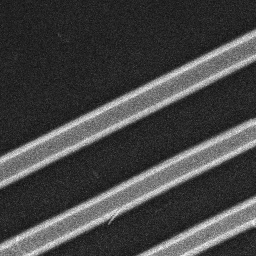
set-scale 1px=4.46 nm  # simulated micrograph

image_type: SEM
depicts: one or a few lines or trenches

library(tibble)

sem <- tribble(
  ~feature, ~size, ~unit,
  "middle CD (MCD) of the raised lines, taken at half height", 97.3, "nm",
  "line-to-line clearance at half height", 242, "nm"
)